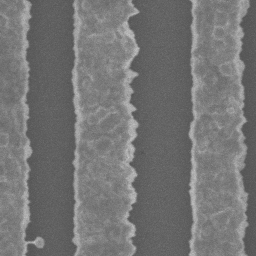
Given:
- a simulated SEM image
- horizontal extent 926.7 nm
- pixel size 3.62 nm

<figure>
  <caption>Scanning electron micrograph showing one or a few lines or trenches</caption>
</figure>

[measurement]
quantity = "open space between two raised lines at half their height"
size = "194 nanometers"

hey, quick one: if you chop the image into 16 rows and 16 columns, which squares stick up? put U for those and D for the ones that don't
UUDDDUUUDDDDUUUD
UUDDDUUUDDDDUUUD
UUDDDUUUDDDDUUUD
UUDDDUUUDDDDUUUD
UUDDDUUUDDDDUUUD
UUDDDUUUDDDDUUUD
UUDDDUUUDDDDUUUD
UUDDDUUUDDDDUUUD
UUDDDUUUDDDDUUUD
UUDDDUUUDDDDUUUD
UUDDDUUUDDDDUUUD
UUDDDUUUDDDDUUUD
UUDDDUUUDDDDUUUD
UUDDDUUUDDDDUUUD
UDDDDUUUDDDDUUUD
UUDDDUUUDDDDUUUD